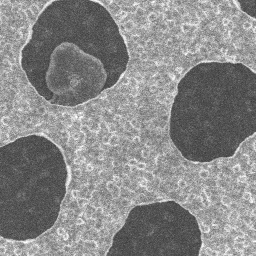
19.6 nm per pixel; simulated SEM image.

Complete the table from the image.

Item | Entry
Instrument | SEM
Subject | holes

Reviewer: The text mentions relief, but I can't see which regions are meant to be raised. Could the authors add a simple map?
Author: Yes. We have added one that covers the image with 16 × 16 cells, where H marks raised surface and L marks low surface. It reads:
HHHLLLLHHHHHHHHL
HHLLLLLHHHHHHHHH
HHLLLLLLHHHHHHHH
HLLLLLLLHHHHHHHH
HHLLLLLLHHHHLLLL
HHLLLLLHHHHLLLLL
HHHLLHHHHHHLLLLL
HHHHHHHHHHHLLLLL
HHLHHHHHHHHLLLLL
LLLLHHHHHHHLLLLH
LLLLHHHHHHHHHHHH
LLLLHHHHHHHHHHHH
LLLLHHHHHHHHHHHH
LLLLHHHHLLLLHHHH
LLLHHHHLLLLLLHHH
HHHHHHHLLLLLLHHH